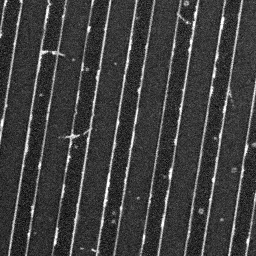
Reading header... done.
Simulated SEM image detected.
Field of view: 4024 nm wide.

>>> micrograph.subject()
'parallel lines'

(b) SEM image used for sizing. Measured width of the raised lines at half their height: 17.9 pixels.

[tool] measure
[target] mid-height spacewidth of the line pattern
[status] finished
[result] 0.402 µm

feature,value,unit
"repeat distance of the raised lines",683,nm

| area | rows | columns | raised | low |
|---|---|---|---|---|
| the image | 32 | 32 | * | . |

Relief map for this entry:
.**...**....**...**...***...**..
***...**...***...**...***...**..
**....**...**....**...**....**..
**....**...**....**...**...***..
**...***...**...***...**...***..
**...**....**...**....**...**...
**...**....**...**....**...**...
**...**...***...**...***...**...
*....**...***...**...**....**...
*....**...**....**...**....**...
*...***...**...***...**....**...
*...***...**...***...**...**....
*...**....**...**....**...**....
*...**...***...**...***...**...*
....**...***...**...***...**...*
....**...**....**...**....**...*
....**...**...***...**...***...*
...***...**...***...**...***...*
...**....**...**....**...**....*
...**....**...**...***...**...**
...**...***...**...***...**...**
...**...**....**...**....**...**
...**...**....**...**....**...**
..***...**...***...**...***...**
..**....**...**....**...**....**
..**....**...**....**...**....**
..**...***...**...***...**...***
..**...***...**...**....**...***
..**...**....**...**....**...**.
.***...**...***...**...***...**.
.***...**...***...**...***...**.
.**....**...**....**...**....**.